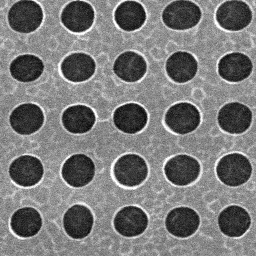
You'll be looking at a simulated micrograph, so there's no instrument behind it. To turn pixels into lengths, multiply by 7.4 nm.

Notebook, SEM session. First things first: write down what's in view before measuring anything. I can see a regular array of holes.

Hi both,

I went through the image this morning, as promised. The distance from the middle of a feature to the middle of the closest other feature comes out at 0.379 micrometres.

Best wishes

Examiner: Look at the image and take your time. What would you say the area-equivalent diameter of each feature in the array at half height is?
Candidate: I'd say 249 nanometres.